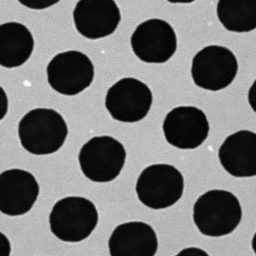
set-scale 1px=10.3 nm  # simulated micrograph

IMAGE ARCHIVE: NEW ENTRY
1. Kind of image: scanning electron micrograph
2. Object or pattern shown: a regular array of holes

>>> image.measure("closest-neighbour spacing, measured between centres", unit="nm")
660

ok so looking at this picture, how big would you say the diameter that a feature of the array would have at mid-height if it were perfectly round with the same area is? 480 nm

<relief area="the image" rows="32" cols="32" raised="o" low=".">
ooo....ooo....ooooooooooooo.....
ooooooooo......oooooooooooo.....
ooooooooo......ooo..ooooooo.....
...ooooooo.....oo.....oooooo....
....oooooo...ooo......oooooooooo
....oooooooooooo......oooooooooo
....oooo..ooooooo.....ooo....ooo
...ooo.....ooooooo...ooo......oo
o.oooo......oooooooooooo......oo
oooooo......oooooooooooo.....ooo
oooooo.....ooo....oooooo.....ooo
.oooooo...ooo......oooooooooooo.
.oooooooooooo......oooooooooooo.
.oooo.ooooooo......ooo...oooooo.
.oo.....oooooo....ooo.....oooooo
oo......oooooooooooo......oooooo
oo......oooooooooooo......oooo..
oo......ooo...ooooooo.....oo....
ooo....ooo.....ooooooo..ooo.....
oooooooooo......ooooooooooo.....
oooooooooo.....ooooo.ooooooo....
....oooooo.....ooo....oooooo....
....ooooooo...ooo......ooooooooo
.....oooooooooooo......ooooooooo
.....oooooooooooo......oo....ooo
....ooo.....oooooo....oo......oo
...ooo......oooooooooooo......oo
oooooo......oooooooooooo......oo
oooooo......oo.....oooooo....ooo
.oooooo....ooo......oooooo..oooo
.ooooooooooooo......ooooooooooo.
.ooooooooooooo......oo....oooooo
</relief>